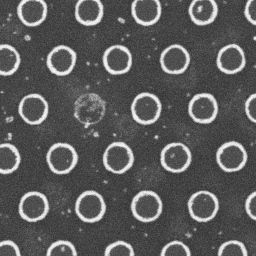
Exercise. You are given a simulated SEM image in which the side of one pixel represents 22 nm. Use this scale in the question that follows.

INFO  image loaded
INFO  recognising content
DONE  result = a regular array of raised bodies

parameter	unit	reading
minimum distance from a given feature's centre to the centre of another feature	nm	1240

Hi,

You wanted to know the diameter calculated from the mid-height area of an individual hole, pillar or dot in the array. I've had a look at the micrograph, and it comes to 606 nm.